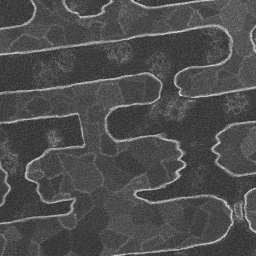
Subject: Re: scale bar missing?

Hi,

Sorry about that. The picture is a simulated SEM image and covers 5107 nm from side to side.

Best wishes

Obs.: one or a few lines or trenches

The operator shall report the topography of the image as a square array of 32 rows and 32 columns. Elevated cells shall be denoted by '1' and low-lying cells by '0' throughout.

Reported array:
00001111000001111000001111111111
00001111100001111111111111111111
00001111111111111111111111111111
11111111111111111111111100001111
11111111111111111100000000000110
11111111111000000000000000000111
11100000000000000000000000000111
00000000000000000000000000001111
00000000000000000000000011111111
00000000000000001110001111111111
00000000001111111111001111111111
00111111111111111111000111111000
11111111111111111111000000000000
11111111111111000000000000000000
11111111001110000000000000000000
00000000001110000000000000000011
00000000001110000000000000001111
00000000001111001111100000011111
00000000111111111111110000011111
00000111111111111111111000011111
00001111111111111111111000011111
10011111111111111111110000000111
10001111111111111111110000000000
10000111111111111111000000000000
10000111111111111000000001000001
00000000011111111111111111110001
00000000011111111111111111111011
00011111111111111111111111111001
11111111111111111111111111111001
11111111111111111111111111110000
11111111111111111111111110000000
11111111111111111110000000000000